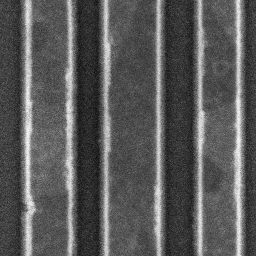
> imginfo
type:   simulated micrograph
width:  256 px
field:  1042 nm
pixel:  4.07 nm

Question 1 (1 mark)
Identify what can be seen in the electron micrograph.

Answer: one or a few lines or trenches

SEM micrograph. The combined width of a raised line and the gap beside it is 346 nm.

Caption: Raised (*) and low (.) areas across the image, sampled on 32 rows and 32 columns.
...******....*******.....*****..
...******....*******.....*****..
....*****....*******.....*****..
....*****....*******.....*****..
....*****....*******.....*****..
....*****....*******.....*****..
....*****....*******.....*****..
....*****....*******.....*****..
....*****....*******.....*****..
...******....*******.....*****..
....*****....*******.....*****..
....*****....*******.....*****..
....*****....*******.....*****..
...******....*******.....*****..
...******....*******.....*****..
...******....*******.....*****..
...******....*******.....*****..
....*****....*******.....*****..
....*****....*******.....*****..
....*****....*******.....*****..
....*****....*******.....*****..
....*****....*******.....*****..
....*****....*******.....*****..
....*****....*******.....*****..
...******....*******.....*****..
...******....*******.....*****..
....*****....*******.....*****..
....*****....*******.....*****..
...******....*******.....*****..
...******....*******.....*****..
...******....*******.....*****..
...******....*******.....*****..